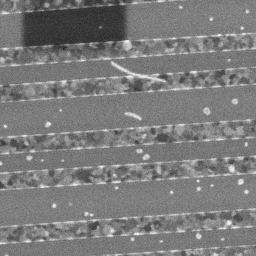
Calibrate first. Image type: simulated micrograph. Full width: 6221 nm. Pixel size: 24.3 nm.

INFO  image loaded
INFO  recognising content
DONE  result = lines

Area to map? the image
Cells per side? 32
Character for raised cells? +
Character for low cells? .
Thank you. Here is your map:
++++++++++++++++................
+++.............................
................................
................................
..........................++++++
...........+++++++++++++++++++++
+++++++++++++++++++++++++.......
+++++++++++.....................
...............................+
................++++++++++++++++
...++++++++++++++++++++++++++++.
++++++++++++++++++..............
+++.............................
................................
................................
........................++++++++
...........+++++++++++++++++++++
++++++++++++++++++++++++++......
++++++++++......................
................................
.................+++++++++++++++
...+++++++++++++++++++++++++++++
+++++++++++++++++++.............
+++.............................
................................
................................
..........................++++++
.............+++++++++++++++++++
++++++++++++++++++++++++++++....
+++++++++++++...................
................................
...................+++++++++++++